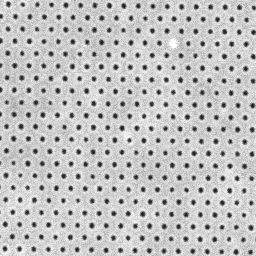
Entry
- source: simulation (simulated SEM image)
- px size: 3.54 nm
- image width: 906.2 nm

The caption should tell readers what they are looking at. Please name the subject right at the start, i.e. a regular array of holes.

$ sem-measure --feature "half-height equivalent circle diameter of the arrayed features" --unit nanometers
19.2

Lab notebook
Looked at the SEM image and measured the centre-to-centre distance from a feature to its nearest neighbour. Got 49.2 nanometers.